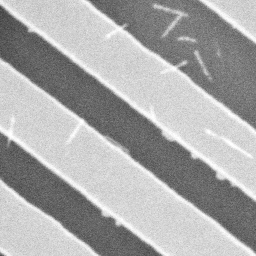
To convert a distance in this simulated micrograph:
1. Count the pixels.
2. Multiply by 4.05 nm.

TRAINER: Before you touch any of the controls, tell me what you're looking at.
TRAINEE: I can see lines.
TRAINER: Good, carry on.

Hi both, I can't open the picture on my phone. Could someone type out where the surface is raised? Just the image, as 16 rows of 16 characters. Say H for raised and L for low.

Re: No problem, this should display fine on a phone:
HHHHHHLLLLLLLHHH
LLHHHHHLLLLLLLHH
LLLHHHHHLLLLLLLL
LLLLHHHHHHLLLLLL
HLLLLHHHHHHLLLLL
HHLLLLLHHHHHLLLL
HHHHLLLLHHHHHHLL
HHHHHLLLLHHHHHHL
HHHHHHLLLLLHHHHH
LLHHHHHHLLLLHHHH
LLLHHHHHHLLLLHHH
LLLLHHHHHHLLLLLH
HHLLLLHHHHHHLLLL
HHHLLLLHHHHHHLLL
HHHHLLLLHHHHHHLL
HHHHHHLLLLHHHHHH